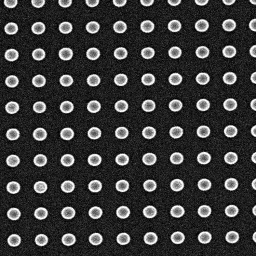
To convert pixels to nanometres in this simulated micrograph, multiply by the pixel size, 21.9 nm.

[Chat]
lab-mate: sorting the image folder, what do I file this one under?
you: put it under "a regular array of raised bodies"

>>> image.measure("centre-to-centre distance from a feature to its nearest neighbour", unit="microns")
0.577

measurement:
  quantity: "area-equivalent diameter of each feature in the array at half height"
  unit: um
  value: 0.257